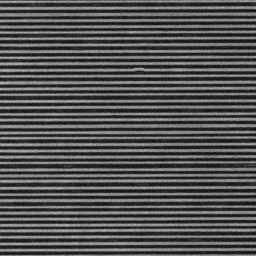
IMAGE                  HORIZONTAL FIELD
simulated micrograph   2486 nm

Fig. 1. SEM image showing parallel lines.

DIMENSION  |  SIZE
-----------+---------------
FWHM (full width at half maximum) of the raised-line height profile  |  0.0255 micrometres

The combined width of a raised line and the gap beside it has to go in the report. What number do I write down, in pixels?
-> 6.2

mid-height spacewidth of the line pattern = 35.2 nm